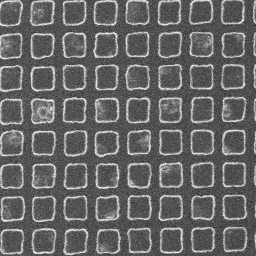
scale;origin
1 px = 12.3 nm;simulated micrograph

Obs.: a regular array of raised bodies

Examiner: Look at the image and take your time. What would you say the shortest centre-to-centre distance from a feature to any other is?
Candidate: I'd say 387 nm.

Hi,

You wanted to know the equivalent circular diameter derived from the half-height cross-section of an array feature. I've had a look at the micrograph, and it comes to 0.314 um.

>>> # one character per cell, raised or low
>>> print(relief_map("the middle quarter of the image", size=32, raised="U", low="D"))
UUUUDDDDDUUUUDDDDUUDDDDDUUUUUDDD
UUUUUDDDUUUUUDDDUUUUUDDDUUUUUDDD
UUUUUDDDUUUUUDDDUUUUUDDDUUUUUDDD
UUUUUDDDUUUUUDDDUUUUUDDDUUUUUDDD
UUUUUDDDUUUUUDDDUUUUUDDDUUUUUDDD
UUUUUDDDUUUUUDDDUUUUUDDDUUUUUDDD
DDDDDDDDDDDDDDDDDDDDDDDDDDDDDDDD
DDDDDDDDDDDDDDDDDDDDDDDDDDDDDDDD
DDDDDDDDDDDDDDDDDDDDDDDDDDDDDDDD
UUUUUDDDUUUUUDDDUUUUUDDDUUUUUDDD
UUUUUDDDUUUUUDDDUUUUUDDDUUUUUDDD
UUUUUDDDUUUUUUDDUUUUUDDDUUUUUDDD
UUUUUDDDUUUUUUDDUUUUUDDDUUUUUDDD
UUUUUDDDUUUUUDDDUUUUUDDDUUUUUDDD
DDUUUDDDDDDDDDDDDUDDDDDDDUUUDDDD
DDDDDDDDDDDDDDDDDDDDDDDDDDDDDDDD
DDDDDDDDDDDDDDDDDDDDDDDDDDDDDDDD
UUUUUUDDUUUUUDDDUUUUUUDDUUUUUDDD
UUUUUUDDUUUUUDDDUUUUUUDDUUUUUDDD
UUUUUUDDUUUUUDDDUUUUUDDDUUUUUDDD
UUUUUDDDUUUUUUDDUUUUUDDDUUUUUDDD
UUUUUDDDUUUUUDDDUUUUUDDDUUUUUDDD
UUUUDDDDUUUDDDDDUUDDDDDDDUDDDDDD
DDDDDDDDDDDDDDDDDDDDDDDDDDDDDDDD
DDDDDDDDDDDDDDDDDDDDDDDDDDDDDDDD
DUUUUDDDUUUUUDDDUUUUUDDDUUUUUDDD
UUUUUUDDUUUUUDDDUUUUUUDDUDUUUDDD
UUUUUUDDUUUUUUDDUUUUUUDDUUUUUDDD
UUUUUDDDUUUUUUDDUUUUUUDDUUUUUUDD
UUUUUUDDUUUUUUDDUUUUUDDDUUUUUUDD
UUUUUDDDUUUUUDDDDUUUUDDDDUUUUDDD
DDDDDDDDDDDDDDDDDDDDDDDDDDDDDDDD